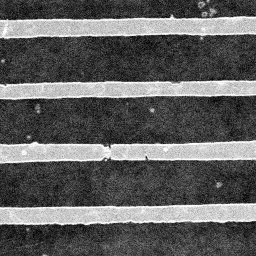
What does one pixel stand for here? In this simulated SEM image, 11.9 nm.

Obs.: one or a few lines or trenches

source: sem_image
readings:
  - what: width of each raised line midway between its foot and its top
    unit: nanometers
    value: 186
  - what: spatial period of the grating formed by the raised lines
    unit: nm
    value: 742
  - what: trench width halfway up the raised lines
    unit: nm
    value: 559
